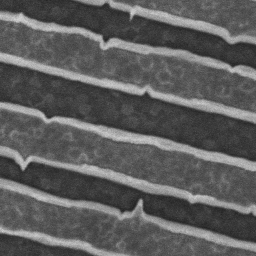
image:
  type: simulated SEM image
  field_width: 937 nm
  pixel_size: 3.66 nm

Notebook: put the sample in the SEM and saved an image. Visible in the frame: one or a few lines or trenches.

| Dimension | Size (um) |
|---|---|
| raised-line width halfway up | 0.163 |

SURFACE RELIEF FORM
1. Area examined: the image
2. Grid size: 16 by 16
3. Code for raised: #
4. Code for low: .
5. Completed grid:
........########
##..........####
######..........
############....
....############
........########
............####
####............
########........
############....
.....###########
#.......########
####........####
#########.......
############....
.....###########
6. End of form